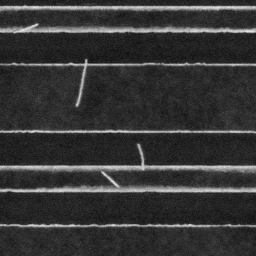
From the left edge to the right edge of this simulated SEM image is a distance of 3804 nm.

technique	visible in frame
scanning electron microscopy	lines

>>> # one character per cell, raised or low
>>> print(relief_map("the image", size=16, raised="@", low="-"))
@@@@@@@@@@@@@@@@
@@@@@@@@@@@@@@@@
----------------
----------------
@@@@@@@@@@@@@@@@
@@@@@@@@@@@@@@@@
@@@@@@@@@@@@@@@@
@@@@@@@@@@@@@@@@
----------------
----------------
@@@@@@@@@@@@@---
@@@@@@@@@@@@@@@@
----------------
----------------
@@@@@@@@@@@@@@@@
@@@@@@@@@@@@@@@@